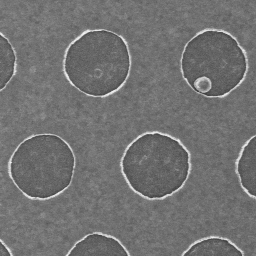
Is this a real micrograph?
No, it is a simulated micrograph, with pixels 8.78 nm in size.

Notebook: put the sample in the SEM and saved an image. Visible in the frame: holes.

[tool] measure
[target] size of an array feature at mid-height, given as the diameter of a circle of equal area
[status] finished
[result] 566 nm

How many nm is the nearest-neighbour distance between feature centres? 1010